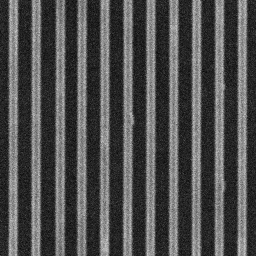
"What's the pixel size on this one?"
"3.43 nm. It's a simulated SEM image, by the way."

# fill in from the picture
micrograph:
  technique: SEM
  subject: parallel lines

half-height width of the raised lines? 22.7 nanometres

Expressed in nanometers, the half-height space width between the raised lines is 54.5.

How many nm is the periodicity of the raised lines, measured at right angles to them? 78.6